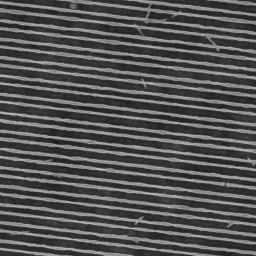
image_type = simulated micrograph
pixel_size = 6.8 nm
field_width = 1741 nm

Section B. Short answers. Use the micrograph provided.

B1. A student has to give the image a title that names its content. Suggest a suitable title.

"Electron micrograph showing parallel lines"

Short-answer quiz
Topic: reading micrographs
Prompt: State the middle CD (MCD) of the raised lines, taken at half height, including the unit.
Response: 18.6 nm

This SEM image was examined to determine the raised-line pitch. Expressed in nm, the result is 61.9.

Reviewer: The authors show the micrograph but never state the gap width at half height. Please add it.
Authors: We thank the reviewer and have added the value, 0.043 microns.